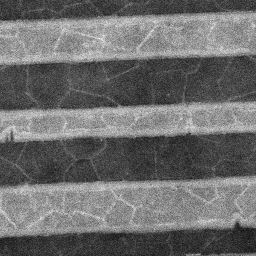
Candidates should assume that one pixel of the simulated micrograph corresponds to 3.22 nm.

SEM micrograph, one or a few lines or trenches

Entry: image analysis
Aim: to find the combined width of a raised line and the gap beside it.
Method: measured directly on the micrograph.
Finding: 272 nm